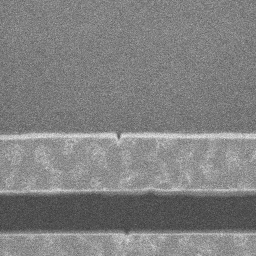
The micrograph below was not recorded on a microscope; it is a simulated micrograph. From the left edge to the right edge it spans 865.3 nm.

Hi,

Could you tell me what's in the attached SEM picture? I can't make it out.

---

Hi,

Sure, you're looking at one or a few lines or trenches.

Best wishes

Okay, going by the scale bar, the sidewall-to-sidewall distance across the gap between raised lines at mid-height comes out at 135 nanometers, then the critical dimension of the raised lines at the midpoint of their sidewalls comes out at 193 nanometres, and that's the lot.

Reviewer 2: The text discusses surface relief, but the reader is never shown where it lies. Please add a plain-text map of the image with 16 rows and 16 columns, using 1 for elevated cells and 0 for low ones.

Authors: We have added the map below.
0000000000000000
0000000000000000
0000000000000000
0000000000000000
0000000000000000
0000000000000000
0000000000000000
0000000000000000
0011111011111111
1111111111111111
1111111111111111
1111111111111111
0000000000000000
0000000000000000
0000000000000000
1111111111111111